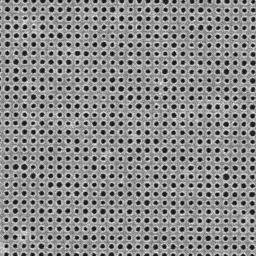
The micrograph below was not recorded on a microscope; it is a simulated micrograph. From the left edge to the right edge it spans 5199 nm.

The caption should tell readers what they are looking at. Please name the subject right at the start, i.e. a regular array of holes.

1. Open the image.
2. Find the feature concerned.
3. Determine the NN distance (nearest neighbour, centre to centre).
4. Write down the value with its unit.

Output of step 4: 174 nm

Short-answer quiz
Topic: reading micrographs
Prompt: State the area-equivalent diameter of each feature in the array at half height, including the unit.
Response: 4.79 pixels